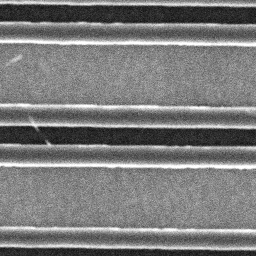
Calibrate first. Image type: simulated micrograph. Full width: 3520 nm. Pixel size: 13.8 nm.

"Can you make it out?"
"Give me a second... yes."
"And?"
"lines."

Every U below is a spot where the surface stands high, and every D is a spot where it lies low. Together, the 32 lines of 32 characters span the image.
DDDDDDDDUUUUUUUUUUUUUUUUUUUUUUUU
DDDDDDDDDDDDDDDDDDDDDDDDDDDDDDDD
DDDDDDDDDDDDDDDDDDDDDDDDDDDDDDDD
UUUUUUUUUUUUUUUUUUUUUUUUUUUUUUUU
UUUUUUUUUUUUUUUUUUUUUUUUUUUUUUUU
DDDDDDDDDDDDDDDDDDDDDDDUUUUUUUUU
DDDDDDDDDDDDDDDDDDDDDDDDDDDDDDDD
DDDDDDDDDDDDDDDDDDDDDDDDDDDDDDDD
DDDDDDDDDDDDDDDDDDDDDDDDDDDDDDDD
DDDDDDDDDDDDDDDDDDDDDDDDDDDDDDDD
DDDDDDDDDDDDDDDDDDDDDDDDDDDDDDDD
DDDDDDDDDDDDDDDDDDDDDDDDDDDDDDDD
DDDDDDDDDDDDDDDDDDDDDDDDDDDDDDDD
UUUUUUUUUUUUUUUUUUUUUUUUUUUDDDDD
UUUUUUUUUUUUUUUUUUUUUUUUUUUUUUUU
UUUUUUUUUUUUUUUUUUUUUUUUUUUUUUUU
DDDDDDDDDDDDDDDDDDDDDDDDDDDDDDDD
DDDDDDDDDDDDDDDDDDDDDDDDDDDDDDDD
UUUUUUUUUUUUUUUUUUUUUUUUUUUUUUUU
UUUUUUUUUUUUUUUUUUUUUUUUUUUUUUUU
UUUUUUUUUUUUUUUUUUUUUUUUUUUUUUUU
DDDDDDDDDDDDDDDDDDDDDDDDDDDDDDDD
DDDDDDDDDDDDDDDDDDDDDDDDDDDDDDDD
DDDDDDDDDDDDDDDDDDDDDDDDDDDDDDDD
DDDDDDDDDDDDDDDDDDDDDDDDDDDDDDDD
DDDDDDDDDDDDDDDDDDDDDDDDDDDDDDDD
DDDDDDDDDDDDDDDDDDDDDDDDDDDDDDDD
DDDDDDDDDDDDDDDDDDDDDDDDDDDDDDDD
UUUUUDUDDDDDDDDDDDDDDDDDDDDDDDDD
UUUUUUUUUUUUUUUUUUUUUUUUUUUUUUUU
UUUUUUUUUUUUUUUUUUUUUUUUUUUUUUUU
DDDDDDDDDDDDDDDDDDDDDDDDDDDDDDDD